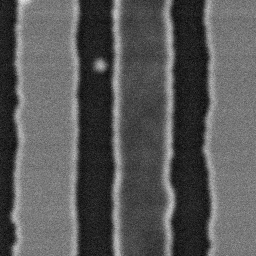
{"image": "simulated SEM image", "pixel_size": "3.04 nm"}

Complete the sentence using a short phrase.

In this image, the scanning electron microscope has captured lines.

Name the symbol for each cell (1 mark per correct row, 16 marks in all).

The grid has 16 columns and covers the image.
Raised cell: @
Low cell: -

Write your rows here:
-@@@@--@@@@--@@@
-@@@@--@@@@--@@@
-@@@@--@@@@--@@@
-@@@@--@@@@--@@@
-@@@@--@@@@--@@@
-@@@@--@@@@--@@@
-@@@@--@@@@--@@@
-@@@@--@@@@--@@@
-@@@@--@@@@--@@@
-@@@@--@@@@--@@@
-@@@@--@@@@--@@@
-@@@@--@@@@--@@@
-@@@@--@@@@--@@@
-@@@@--@@@@--@@@
-@@@@--@@@@--@@@
-@@@@--@@@@--@@@